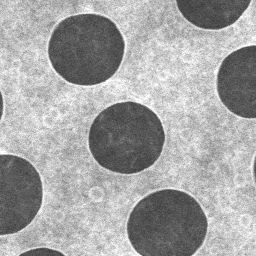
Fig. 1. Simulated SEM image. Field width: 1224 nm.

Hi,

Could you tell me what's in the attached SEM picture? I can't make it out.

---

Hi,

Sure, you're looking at holes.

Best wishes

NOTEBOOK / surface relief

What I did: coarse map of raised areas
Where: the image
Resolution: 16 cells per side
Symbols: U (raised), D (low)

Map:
UUUUUUUUUUUDDDDU
UUUUDDDUUUUUDDUU
UUUDDDDDUUUUUUUU
UUUDDDDDUUUUUUDD
UUUUDDDUUUUUUUDD
UUUUUUUUUUUUUUDD
UUUUUUUDDUUUUUDD
UUUUUUDDDDUUUUUU
UUUUUUDDDDUUUUUU
UUUUUUDDDDUUUUUU
DDUUUUUDDUUUUUUU
DDDUUUUUUUUUUUUU
DDDUUUUUUDDDUUUU
DDUUUUUUDDDDDUUU
DUUUUUUUDDDDDUUU
UUUUUUUUDDDDUUUU